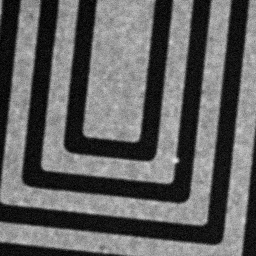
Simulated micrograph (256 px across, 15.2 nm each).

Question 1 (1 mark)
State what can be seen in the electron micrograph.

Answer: groups of lines, slits or small figures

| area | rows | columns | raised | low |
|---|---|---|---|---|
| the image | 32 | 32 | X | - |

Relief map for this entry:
---XX--XXX--XXXXXXX---XX--XXX--X
---XX--XXX--XXXXXXX---XX--XXX--X
--XXX--XX---XXXXXXX--XXX--XXX--X
--XXX--XX---XXXXXXX--XXX--XX---X
--XXX--XX---XXXXXXX--XXX--XX---X
--XX---XX---XXXXXXX--XX---XX---X
--XX---XX---XXXXXXX--XX---XX---X
--XX---XX--XXXXXXXX--XX---XX--XX
--XX--XXX--XXXXXXX---XX---XX--XX
--XX--XXX--XXXXXXX---XX--XXX--XX
--XX--XXX--XXXXXXX---XX--XXX--XX
-XXX--XXX--XXXXXXX---XX--XXX--XX
-XXX--XX---XXXXXXX--XXX--XX---XX
-XXX--XX---XXXXXXX--XXX--XX---XX
-XX---XX---XXXXXXX--XX---XX---XX
-XX---XX---XXXXXXX--XX---XX---XX
-XX---XX---XXXXXX---XX---XX---XX
-XX---XX-------XX---XX---XX--XXX
-XX--XXX------------XX--XXX--XXX
-XX--XXXXXX--------XXX--XXX--XX-
XXX--XXXXXXXXXXXXXXXXX--XXX--XX-
XXX-----XXXXXXXXXXXXXX--XX---XX-
XXX--------------XXXXX--XX---XX-
XXXX--------------------XX---XX-
XXXXXXXXXXXXXX----------XX---XX-
-XXXXXXXXXXXXXXXXXXXXXXXXX---XX-
----------XXXXXXXXXXXXXXXX--XXX-
-------------------XXXXXXX--XXX-
XXXXXX----------------------XX--
XXXXXXXXXXXXXXX-------------XX--
---XXXXXXXXXXXXXXXXXXXXX---XXX--
------------XXXXXXXXXXXXXXXXXX--